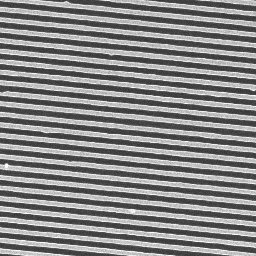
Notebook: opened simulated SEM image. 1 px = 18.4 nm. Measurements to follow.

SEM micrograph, parallel lines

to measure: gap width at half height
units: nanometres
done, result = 87.9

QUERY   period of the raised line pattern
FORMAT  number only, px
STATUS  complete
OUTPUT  10.5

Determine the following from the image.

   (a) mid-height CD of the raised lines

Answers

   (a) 98.2 nanometers